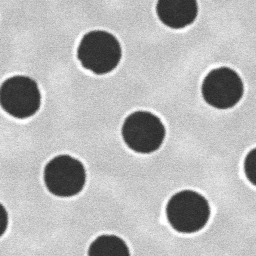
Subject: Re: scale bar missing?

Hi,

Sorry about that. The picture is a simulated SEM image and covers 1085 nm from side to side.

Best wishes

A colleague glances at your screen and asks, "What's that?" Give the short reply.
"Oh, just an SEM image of holes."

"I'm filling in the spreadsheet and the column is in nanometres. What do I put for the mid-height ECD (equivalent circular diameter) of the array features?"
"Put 187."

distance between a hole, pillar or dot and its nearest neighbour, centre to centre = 383 nm